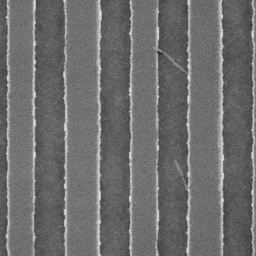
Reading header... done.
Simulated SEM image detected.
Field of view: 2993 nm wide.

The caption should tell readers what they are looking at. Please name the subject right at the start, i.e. lines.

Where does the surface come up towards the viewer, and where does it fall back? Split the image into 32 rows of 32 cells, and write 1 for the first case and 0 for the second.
01110000111100001111000011110000
01110000111110001111000011110000
01110000111110001111000011110000
01110000111110001111000011110000
01110000111110001111000011110000
01110000111100001111000011110000
01110000111100001111000011110000
01110000111110001111000011110000
01110000111110001111000011110000
01110000111110001111000011110000
01110000111100001111000011110000
01110000111100001111000011110000
01110000111110001111000011110000
01110000111110001111000011110000
01110000111110001111000011110000
01110000111110001111000011110000
01110000111110001111000011110000
01110000111110001111000011110000
01110000111100001111000011110000
01110000111100001111000011110000
01110000111100001111000011110000
01110000111100001111000011110000
01110000111100001111000011110000
01110000111100001111000111110000
01110000111100001111000011110000
01110000111100001111000011110000
01110000111100001111000011110000
01110000111100001111000011110000
01110000111100001111000011110000
01110000111100001111000011110000
01110000111100001111000011110000
01110000111100001111000011110000